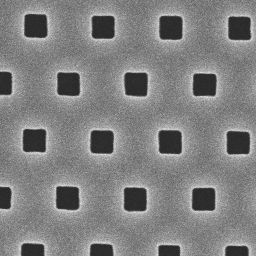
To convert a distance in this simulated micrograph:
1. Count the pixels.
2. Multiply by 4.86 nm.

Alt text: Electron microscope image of a regular array of holes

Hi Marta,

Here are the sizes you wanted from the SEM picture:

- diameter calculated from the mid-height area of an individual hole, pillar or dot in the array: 126 nanometres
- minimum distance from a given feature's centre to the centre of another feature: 66 pixels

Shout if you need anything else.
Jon